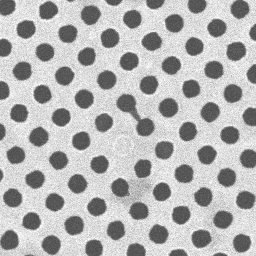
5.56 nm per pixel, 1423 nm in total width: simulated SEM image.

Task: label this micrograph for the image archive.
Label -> a regular array of holes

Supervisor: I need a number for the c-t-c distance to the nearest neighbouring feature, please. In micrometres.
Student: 0.163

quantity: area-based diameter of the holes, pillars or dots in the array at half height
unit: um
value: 0.105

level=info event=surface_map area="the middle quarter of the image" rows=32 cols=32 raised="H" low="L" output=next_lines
HHHHHLHHHHHHHHLLLLHHHHHHLLLLLHHH
LLHHHHHHHHHHHHHLLHHHHHHHHLLLLHHH
LLLHHHHHHLLLLHHHHHHHHHHHHHLLHHHH
LLLHHHHHLLLLLHHHHHHHLLLHHHHHHHHH
LLHHHHHHLLLLLHHHHHHLLLLHHHHHHHLL
HHHHHHHHHLLLLHHHHHHLLLLHHHHHHHLL
HHHHLLHHHHHHHHHHHHHLLLLHHHHHHHLL
HHHLLLLHHHHHHHHLHHHHLLHHHHHHHHLL
HHHLLLLLHHHHHHLLLLHHHHHHHHLHHHHL
HHHLLLLHHHHHHLLLLLHHHHHHLLLLHHHH
HHHHLLLHHHHHHLLLLLHHHHHHLLLLLHHH
LHHHHHHHHHHHHHLLLLHHHHHHLLLLLHHH
LLHHHHHHHLLHHHHHLLLHHHHHLLLLHHHH
LLHHHHHHLLLLHHHHHLLHLHHHHHHHHHHH
LHHHHHHHLLLLHHHHHHLLLLHHHHHHHHLL
HHHHHHHHLLLLHHHHHHLLLLLHHHHHHLLL
HHHHHHHHLLLHHHHHHHLLLLLHHHHHHLLL
HHHLLLHHHHHHHHHHHHHLLLHHHHHHHLLL
HHLLLLHHHHHHHHHHHHHHHHHHHHHHHLLL
HHLLLLLHHHHHHHHHHHHHHHHHLLHHHHHH
HHLLLLHHHHHHHHHHHHHHHHHLLLLHHHHH
HHHHLHHHHHHHHHHHHHHHHHHLLLLLHHHH
HHHHHHHHHHHHHHHHHHHHHHHLLLLHHHHH
LHHHHHHLLLLHHHHHHHHHHHHHLLHHHHHH
LHHHHHHLLLLHHHHHHHLLLHHHHHHHHHHH
HHHHHHHLLLLHHHHHHHLLLLHHHHHHHLLL
HHHHHHHLLLLHHHHHHHLLLLHHHHHHLLLL
HHHLHHHHHHHHHHHHHHLLLLHHHHHHLLLL
HHLLLHHHHHHHHHHHHHHHHHHHHHHHLLLL
HLLLLLHHHHHHLLLLHHHHHHHHHHHHHLLL
HLLLLLHHHHHHLLLLHHHHHHHLLLHHHHHH
HHLLLHHHHHHHLLLLHHHHHHLLLLLHHHHH